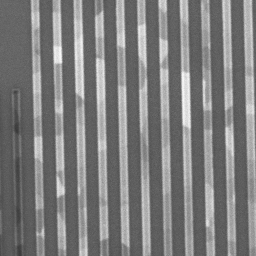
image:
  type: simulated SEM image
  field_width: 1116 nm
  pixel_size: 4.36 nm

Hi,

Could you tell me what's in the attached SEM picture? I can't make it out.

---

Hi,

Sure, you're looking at parallel lines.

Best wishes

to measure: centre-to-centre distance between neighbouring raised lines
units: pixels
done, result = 21.3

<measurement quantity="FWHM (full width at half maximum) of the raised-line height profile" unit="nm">26.7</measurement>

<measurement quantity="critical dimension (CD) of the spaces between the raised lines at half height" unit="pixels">14.9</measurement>